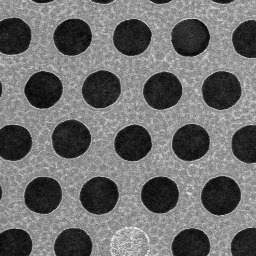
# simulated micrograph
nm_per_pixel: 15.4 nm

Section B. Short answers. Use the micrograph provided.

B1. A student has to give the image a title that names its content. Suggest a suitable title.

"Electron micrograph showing a regular array of holes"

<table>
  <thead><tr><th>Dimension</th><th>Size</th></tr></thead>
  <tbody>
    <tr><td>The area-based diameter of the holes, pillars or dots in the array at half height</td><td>585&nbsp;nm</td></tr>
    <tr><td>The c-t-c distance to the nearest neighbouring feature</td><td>894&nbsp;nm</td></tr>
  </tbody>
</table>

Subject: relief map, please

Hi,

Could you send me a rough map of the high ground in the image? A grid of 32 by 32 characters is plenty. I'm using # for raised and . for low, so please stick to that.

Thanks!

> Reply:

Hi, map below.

################################
################################
...#####..######.######..#######
....###....###.....###....###...
....###.....##.....##.....###...
....###....###.....###....###...
...#####..#####...####...#####..
################################
################################
####...####...#####...####...###
###.....##.....###.....##.....##
###.....##.....###.....##.....##
####...####....###....####....##
#####.######.######..######..###
################################
#######...######################
....###....####...####....###...
....##.....###.....###....###...
....###....###.....###....###...
...####...#####...####...####...
################################
################################
####...####...#####..#####...###
###.....##.....###....###.....##
###.....##.....###....###.....##
###....###....####....###.....##
####..#####..######..#####...###
################################
###############################.
....###....###########....###...
....###....##########.....###...
....###....##########.....###...